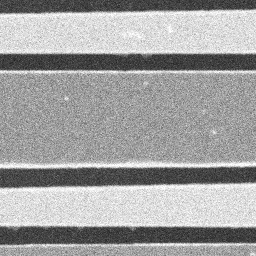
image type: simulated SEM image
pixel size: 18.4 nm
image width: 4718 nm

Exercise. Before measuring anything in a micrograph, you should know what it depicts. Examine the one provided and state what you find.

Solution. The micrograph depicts lines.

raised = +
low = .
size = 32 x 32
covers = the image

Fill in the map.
................................
......................++++++++++
++++++++++++++++++++++++++++++++
++++++++++++++++++++++++++++++++
++++++++++++++++++++++++++++++++
++++++++++++++++++++++++++++++++
++++++++++++++++++++++++++++++++
................................
................................
++++++++++++++++++++++++++++++++
++++++++++++++++++++++++++++++++
++++++++++++++++++++++++++++++++
++++++++++++++++++++++++++++++++
++++++++++++++++++++++++++++++++
++++++++++++++++++++++++++++++++
++++++++++++++++++++++++++++++++
++++++++++++++++++++++++++++++++
++++++++++++++++++++++++++++++++
++++++++++++++++++++++++++++++++
++++++++++++++++++++++++++++++++
++++++++++++++++++++++++++++++++
................................
................................
.....+++++++++++++++++++++++++++
++++++++++++++++++++++++++++++++
++++++++++++++++++++++++++++++++
++++++++++++++++++++++++++++++++
++++++++++++++++++++++++++++++++
................................
................................
................................
++++++++++++++++++++++++++++++++